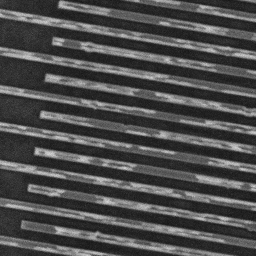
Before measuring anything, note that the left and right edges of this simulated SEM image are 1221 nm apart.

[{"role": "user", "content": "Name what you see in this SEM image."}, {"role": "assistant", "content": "parallel lines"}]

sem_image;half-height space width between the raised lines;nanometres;50.5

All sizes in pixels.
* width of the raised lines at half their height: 7.65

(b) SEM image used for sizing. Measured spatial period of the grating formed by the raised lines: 88.7 nm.